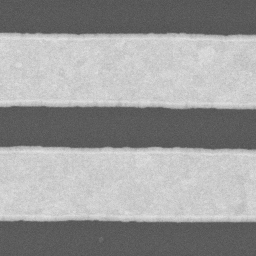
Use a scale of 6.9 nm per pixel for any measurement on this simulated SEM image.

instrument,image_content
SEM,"lines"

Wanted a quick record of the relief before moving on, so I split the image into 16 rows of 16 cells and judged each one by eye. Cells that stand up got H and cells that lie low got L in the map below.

LLLLLLLLLLLLLLLL
LLLLLLLLLLLLLLLL
HHHHHHHHHHHHHHHH
HHHHHHHHHHHHHHHH
HHHHHHHHHHHHHHHH
HHHHHHHHHHHHHHHH
LLLLLLLLHHHHHHHH
LLLLLLLLLLLLLLLL
LLLLLLLLLLLLLLLL
HHHHHHHHHHHHHHHL
HHHHHHHHHHHHHHHH
HHHHHHHHHHHHHHHH
HHHHHHHHHHHHHHHH
HHHHHHHHHHHHHHHH
LLLLLLLLLLLLLLLL
LLLLLLLLLLLLLLLL